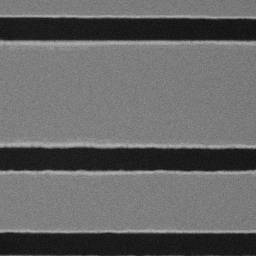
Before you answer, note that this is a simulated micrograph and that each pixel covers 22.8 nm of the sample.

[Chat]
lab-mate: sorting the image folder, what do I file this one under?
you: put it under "lines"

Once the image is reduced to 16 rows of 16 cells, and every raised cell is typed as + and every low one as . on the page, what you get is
++++++++++++++++
................
................
++++++++++++++++
++++++++++++++++
++++++++++++++++
++++++++++++++++
++++++++++++++++
++++++++++++++++
................
................
++++++++++++++++
++++++++++++++++
++++++++++++++++
+.++++++++++++++
................